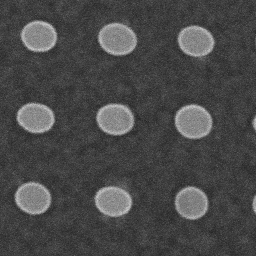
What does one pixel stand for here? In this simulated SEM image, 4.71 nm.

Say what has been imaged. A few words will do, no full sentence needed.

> a regular array of raised bodies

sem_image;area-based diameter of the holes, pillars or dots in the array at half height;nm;154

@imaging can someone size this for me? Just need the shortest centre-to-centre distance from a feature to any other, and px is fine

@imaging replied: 78.5